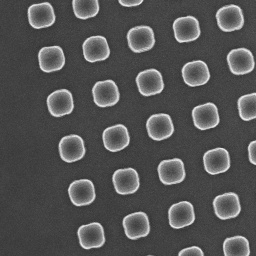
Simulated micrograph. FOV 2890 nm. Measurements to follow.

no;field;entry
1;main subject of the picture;a regular array of raised bodies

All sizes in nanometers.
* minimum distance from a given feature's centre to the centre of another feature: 503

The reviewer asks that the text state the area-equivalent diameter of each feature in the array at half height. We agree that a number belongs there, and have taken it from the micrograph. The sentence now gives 295 nm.